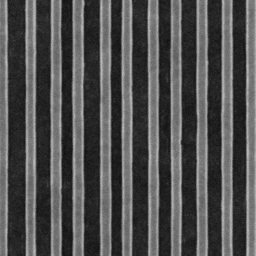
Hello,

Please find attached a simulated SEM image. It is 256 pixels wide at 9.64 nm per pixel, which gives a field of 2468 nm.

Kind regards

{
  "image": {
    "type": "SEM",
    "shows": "parallel lines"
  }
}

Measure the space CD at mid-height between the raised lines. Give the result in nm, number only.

148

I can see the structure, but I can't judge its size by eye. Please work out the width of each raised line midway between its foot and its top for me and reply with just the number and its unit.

0.0952 microns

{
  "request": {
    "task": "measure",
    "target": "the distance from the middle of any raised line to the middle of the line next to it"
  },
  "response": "237 nm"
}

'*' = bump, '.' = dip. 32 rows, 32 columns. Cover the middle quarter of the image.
..***....***...**....***...**...
..***....***...**....***...**...
..***....**....**....**....**...
..***....**....**....**....**...
..***....**....**....***...**...
..***....***...**....***...**...
..***....***...**....**....**...
..***....***...**....***...**...
..***....***...**....***...**...
..***....***...**....***...**...
..***....***...**....***...**...
..***....***...**....**....**...
..***....***...**....***...**...
..***....**....**....***...**...
..***....**....**....***...**...
..***....**....**....***...**...
..***....**....**....***...**...
..***....**....**....***...**...
..***....**....**....***...**...
..***....**....**....***...**...
..***....***...**....***...**...
..***....***...**....***...**...
..***....***...**....***...**...
..***....***...**....**....**...
..***....***...**....**....**...
..***....***...**....**....**...
..***....***...**....***...**...
..***....***...**....***...**...
..***....***...**....***...**...
..***....***...**....***...**...
..***....***...**....***...**...
..***....***...**....***...**...